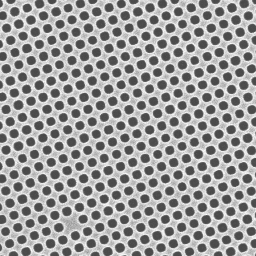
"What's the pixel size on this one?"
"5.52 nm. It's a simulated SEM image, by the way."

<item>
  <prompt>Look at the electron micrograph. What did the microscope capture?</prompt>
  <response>a regular array of holes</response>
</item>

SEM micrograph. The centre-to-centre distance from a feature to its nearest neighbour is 69.9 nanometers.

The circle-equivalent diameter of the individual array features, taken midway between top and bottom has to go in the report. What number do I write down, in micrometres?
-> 0.051